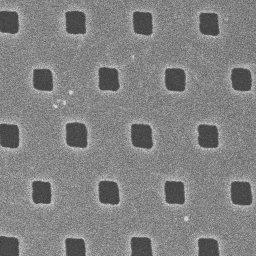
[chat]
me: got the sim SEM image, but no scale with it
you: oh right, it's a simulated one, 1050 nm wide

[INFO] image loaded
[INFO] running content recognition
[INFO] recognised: a regular array of holes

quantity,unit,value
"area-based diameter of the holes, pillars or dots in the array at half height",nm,97.4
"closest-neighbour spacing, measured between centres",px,65.1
